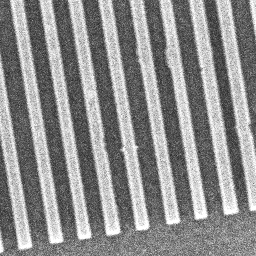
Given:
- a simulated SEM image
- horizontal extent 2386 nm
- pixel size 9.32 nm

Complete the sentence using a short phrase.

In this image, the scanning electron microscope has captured parallel lines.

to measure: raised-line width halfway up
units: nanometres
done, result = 97.7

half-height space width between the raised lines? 0.177 µm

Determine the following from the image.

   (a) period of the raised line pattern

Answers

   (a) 273 nm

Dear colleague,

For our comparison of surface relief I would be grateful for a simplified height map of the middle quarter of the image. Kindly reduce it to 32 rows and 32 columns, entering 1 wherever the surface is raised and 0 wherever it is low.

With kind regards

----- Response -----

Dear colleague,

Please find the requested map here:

00001110000011000001110000111000
00001110000011000001110000011000
00001110000011100000111000011100
00000110000011100000111000011100
00000111000011100000111000001100
00000111000001100000111000001100
00000111000001100000111000001100
00000111000001100000011000001100
10000111000001110000011100001110
10000011000001110000011100001110
10000011100001110000011100000110
10000011100000110000011100000110
10000011100000110000011100000110
10000011100000110000001100000110
10000011100000111000001110000111
11000001100000111000001110000111
11000001110000111000001110000011
11000001110000011000001110000011
11000001110000011000001110000011
11100001110000011000000110000011
11100001110000011100000110000011
11100001110000011100000110000011
01100000111000011100000111000001
01100000111000001100000111000001
01100000111000001100000111000001
01110000111000001100000011000001
01110000111000001110000011100001
01110000011000001110000011100001
00110000011100001110000011100000
00110000011100000110000011100000
00110000011100000110000011100000
00110000011100000110000001100000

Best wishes